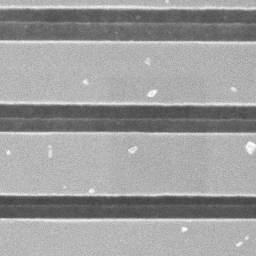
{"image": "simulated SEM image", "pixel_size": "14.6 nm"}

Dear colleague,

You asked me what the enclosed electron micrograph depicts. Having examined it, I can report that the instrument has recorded lines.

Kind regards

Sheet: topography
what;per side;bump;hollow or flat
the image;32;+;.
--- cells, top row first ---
++++++++++++++++++++++++++++++++
................................
................................
................................
................................
++++++++++++++++++++++++++++++++
++++++++++++++++++++++++++++++++
++++++++++++++++++++++++++++++++
++++++++++++++++++++++++++++++++
++++++++++++++++++++++++++++++++
++++++++++++++++++++++++++++++++
++++++++++++++++++++++++++++++++
++++++++++++++++++++++++++++++++
................................
................................
................................
................................
++++++++++++++++++++++++++++++++
++++++++++++++++++++++++++++++++
++++++++++++++++++++++++++++++++
++++++++++++++++++++++++++++++++
++++++++++++++++++++++++++++++++
++++++++++++++++++++++++++++++++
++++++++++++++++++++++++++++++++
.............++...++...+.+++++++
................................
................................
++++++++++++++++++++++++++++++++
++++++++++++++++++++++++++++++++
++++++++++++++++++++++++++++++++
++++++++++++++++++++++++++++++++
++++++++++++++++++++++++++++++++